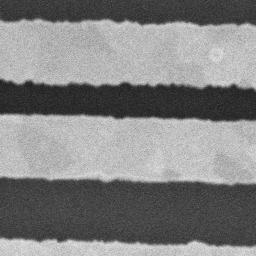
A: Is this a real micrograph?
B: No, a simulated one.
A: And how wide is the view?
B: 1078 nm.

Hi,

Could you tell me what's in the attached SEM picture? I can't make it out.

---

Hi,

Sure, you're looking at lines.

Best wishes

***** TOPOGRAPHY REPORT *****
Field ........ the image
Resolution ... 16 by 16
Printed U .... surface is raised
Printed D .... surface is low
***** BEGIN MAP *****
DDDDDDDDDDDDDDDD
UUUUUUUUUDUUDDDD
UUUUUUUUUUUUUUUU
UUUUUUUUUUUUUUUU
UUUUUUUUUUUUUUUU
DDDDDDDDDDDDDDDU
DDDDDDDDDDDDDDDD
UUUUUUUUUUUUUDDD
UUUUUUUUUUUUUUUU
UUUUUUUUUUUUUUUU
UUUUUUUUUUUUUUUU
DDDDDDDDDDDDDDDD
DDDDDDDDDDDDDDDD
DDDDDDDDDDDDDDDD
DDDDDDDDDDDDDDDD
UUUUUUUUUUUUUUUU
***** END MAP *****